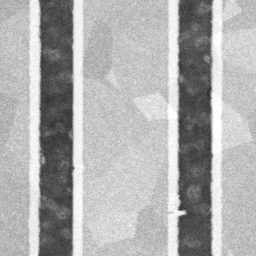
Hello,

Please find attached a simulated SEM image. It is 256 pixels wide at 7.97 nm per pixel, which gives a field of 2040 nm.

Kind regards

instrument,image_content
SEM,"one or a few lines or trenches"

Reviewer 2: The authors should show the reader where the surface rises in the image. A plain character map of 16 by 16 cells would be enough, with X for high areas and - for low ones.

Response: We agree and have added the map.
XX---XXXXXX---XX
XX---XXXXXX---XX
XX---XXXXXX---XX
XX---XXXXXX---XX
XX---XXXXXX---XX
XX---XXXXXX---XX
XX---XXXXXX---XX
XX---XXXXXX--XXX
XX---XXXXXX---XX
XX---XXXXXX---XX
XX---XXXXXX---XX
XX---XXXXXX---XX
XX---XXXXXX---XX
XX---XXXXXX---XX
XX---XXXXXX---XX
XX---XXXXXX--XXX